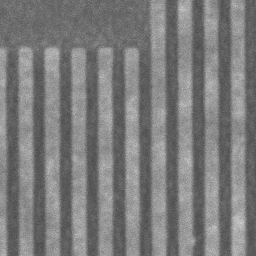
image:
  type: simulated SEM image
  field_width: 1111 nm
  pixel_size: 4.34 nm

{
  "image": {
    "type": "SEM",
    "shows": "parallel lines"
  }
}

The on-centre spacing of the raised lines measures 115 nanometres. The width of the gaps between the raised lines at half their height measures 55.3 nm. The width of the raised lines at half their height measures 59.1 nanometers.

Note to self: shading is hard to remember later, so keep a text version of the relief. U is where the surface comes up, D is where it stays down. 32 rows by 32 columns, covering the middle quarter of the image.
DDUUUDDDDUUUDDDUUUUDDDUUUDDDDUUU
DDUUUDDDDUUUDDDUUUUDDDUUUDDDDUUU
DDUUUDDDDUUUDDDUUUUDDDUUUDDDDUUU
DDUUUDDDDUUUDDDUUUUDDDUUUDDDDUUU
DDUUUDDDDUUUDDDUUUUDDDUUUDDDDUUU
DDUUUDDDDUUUDDDUUUUDDDUUUDDDDUUU
DDUUUDDDDUUUDDDUUUUDDDUUUDDDDUUU
DDUUUDDDDUUUDDDUUUUDDDUUUDDDDUUU
DDUUUDDDDUUUDDDUUUUDDDUUUDDDDUUU
DDUUUDDDDUUUDDDUUUUDDDUUUDDDDUUU
DDUUUDDDDUUUDDDUUUUDDDUUUDDDDUUU
DDUUUDDDDUUUDDDUUUUDDDUUUDDDDUUU
DDUUUDDDDUUUDDDUUUUDDDUUUDDDDUUU
DDUUUDDDDUUUDDDDUUUDDDUUUDDDDUUU
DDUUUDDDDUUUDDDDUUUDDDUUUDDDDUUU
DDUUUDDDDUUUDDDUUUUDDDUUUDDDDUUU
DDUUUDDDDUUUDDDUUUUDDDUUUDDDDUUU
DDUUUDDDDUUUDDDUUUUDDDUUUDDDDUUU
DDUUUDDDDUUUDDDUUUUDDDUUUDDDDUUU
DDUUUDDDDUUUDDDUUUUDDDUUUDDDDUUU
DDUUUDDDDUUUDDDUUUUDDDUUUDDDDUUU
DDUUUDDDDUUUDDDUUUUDDDUUUDDDDUUU
DDUUUDDDDUUUDDDUUUUDDDUUUDDDDUUU
DDUUUDDDDUUUDDDUUUUDDDUUUDDDDUUU
DDUUUDDDDUUUDDDUUUUDDDUUUDDDDUUU
DDUUUDDDDUUUDDDUUUUDDDUUUDDDDUUU
DDUUUDDDDUUUDDDUUUUDDDUUUDDDDUUU
DDUUUDDDDUUUDDDUUUUDDDUUUDDDDUUU
DDUUUDDDDUUUDDDUUUUDDDUUUDDDDUUU
DDUUUDDDDUUUDDDUUUUDDDUUUDDDDUUU
DDUUUDDDDUUUDDDUUUUDDDUUUDDDDUUU
DDUUUDDDDUUUDDDUUUUDDDUUUDDDDUUU